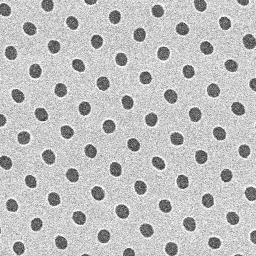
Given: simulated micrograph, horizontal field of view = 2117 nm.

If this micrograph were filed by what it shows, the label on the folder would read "a regular array of holes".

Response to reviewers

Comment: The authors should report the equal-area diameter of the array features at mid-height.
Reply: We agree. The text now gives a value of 114 nanometres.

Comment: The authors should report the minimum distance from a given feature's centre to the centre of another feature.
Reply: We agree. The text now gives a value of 249 nm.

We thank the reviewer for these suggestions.